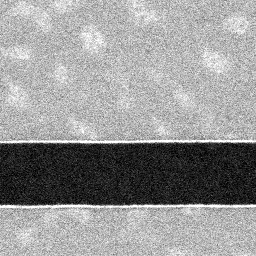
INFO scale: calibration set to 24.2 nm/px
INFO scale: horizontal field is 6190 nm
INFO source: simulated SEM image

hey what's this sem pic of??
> one or a few lines or trenches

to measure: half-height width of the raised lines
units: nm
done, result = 1580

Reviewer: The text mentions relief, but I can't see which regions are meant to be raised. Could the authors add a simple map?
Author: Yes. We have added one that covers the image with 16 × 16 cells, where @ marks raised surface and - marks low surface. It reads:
----------------
----------------
----------------
----------------
----------------
----------------
----------------
----------------
----------------
@@@@@@@@@@@@@@@@
@@@@@@@@@@@@@@@@
@@@@@@@@@@@@@@@@
@@@@@@@@@@@@@@@@
----------------
----------------
----------------